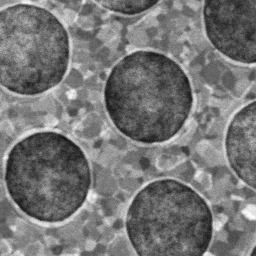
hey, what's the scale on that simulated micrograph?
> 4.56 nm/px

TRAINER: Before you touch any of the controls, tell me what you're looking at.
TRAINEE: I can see holes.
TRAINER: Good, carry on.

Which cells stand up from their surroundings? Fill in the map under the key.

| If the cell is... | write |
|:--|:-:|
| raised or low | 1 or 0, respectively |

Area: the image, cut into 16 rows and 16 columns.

0001110001111000
0000111111111000
0000111111111000
0000111100111100
0000111000001111
0001111000001111
1111111000001110
1111111000001100
1100111100011100
1000011111111100
0000001111111100
0000001110001110
1000011100000111
1100011100000111
1111111100000111
1111111100000111